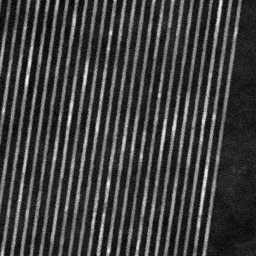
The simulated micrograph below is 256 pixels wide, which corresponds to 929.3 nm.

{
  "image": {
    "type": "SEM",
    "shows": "parallel lines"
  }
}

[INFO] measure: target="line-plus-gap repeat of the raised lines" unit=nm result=34.5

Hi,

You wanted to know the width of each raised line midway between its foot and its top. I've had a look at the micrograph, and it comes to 10.3 nm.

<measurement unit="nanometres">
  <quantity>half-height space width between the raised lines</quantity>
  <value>25.1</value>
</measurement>